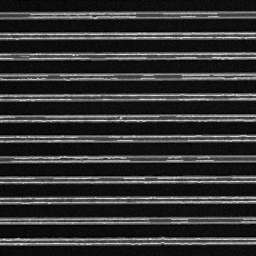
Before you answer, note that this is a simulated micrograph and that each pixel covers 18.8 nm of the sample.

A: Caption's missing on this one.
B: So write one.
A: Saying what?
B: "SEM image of parallel lines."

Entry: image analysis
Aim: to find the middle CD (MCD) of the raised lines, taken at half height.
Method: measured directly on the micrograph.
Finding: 120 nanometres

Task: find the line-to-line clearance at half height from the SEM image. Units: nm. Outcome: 275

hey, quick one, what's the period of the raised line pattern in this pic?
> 386 nanometres